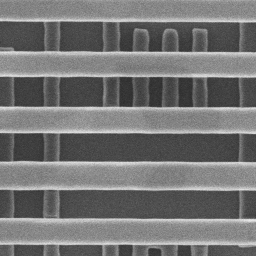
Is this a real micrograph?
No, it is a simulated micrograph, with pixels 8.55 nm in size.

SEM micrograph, wiring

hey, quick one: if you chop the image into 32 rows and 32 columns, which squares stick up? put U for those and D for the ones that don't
UUUUUUUUUUUUUUUUUUUUUUUUUUUUUUUU
UUUUUUUUUUUUUUUUUUUUUUUUUUUUUUUU
UUUUUUUUUUUUUUUUUUUUUUUUUUUUUUUU
DDDDDDDDDDDDDDDDDDDDDDDDDDDDDDDD
DDDDDDDDDDDDDDDDDDDDDDDDDDDDDDDD
DDDDDDDDDDDDDDDDDDDDDDDDDDDDDDDD
UUUUUUUUUUUUDDUUUUUDDDDDDDDDDDDD
UUUUUUUUUUUUUUUUUUUUUUUUUUUUUUUU
UUUUUUUUUUUUUUUUUUUUUUUUUUUUUUUU
UUUUUUUUUUUUUUUUUUUUUUUUUUUUUUUU
DDDDDDDDDDDDDDDDDDDDDDDDDDDDDDDD
DDDDDDDDDDDDDDDDDDDDDDDDDDDDDDDD
DDDDDDDDDDDDDDDDDDDDDDDDDDDDDDDD
UUUUUUUUUUUUUUUUUUUDDUDDDDDDDDDD
UUUUUUUUUUUUUUUUUUUUUUUUUUUUUUUU
UUUUUUUUUUUUUUUUUUUUUUUUUUUUUUUU
UUUUUUUUUUUUUUUUUUUUUUUUUUUUUUUU
DDDDDDDDDDDDDDDDDDDDDDDDDDDDDDDD
DDDDDDDDDDDDDDDDDDDDDDDDDDDDDDDD
DDDDDDDDDDDDDDDDDDDDDDDDDDDDDDDD
UUUUUUUUUUUUUUUUUUUUUUUUUUUUUUUU
UUUUUUUUUUUUUUUUUUUUUUUUUUUUUUUU
UUUUUUUUUUUUUUUUUUUUUUUUUUUUUUUU
UUUUUUUUUUUUUUUUUUUUUUUUUUUUUUUU
DDDDDDDDDDDDDDDDDDDDDDDDDDDDDDDD
DDDDDDDDDDDDDDDDDDDDDDDDDDDDDDDD
DDDDDDDDDDDDDDDDDDDDDDDDDDDDDDDD
UUUUUUUUUUUUUUUUUUUUUUUUUUUUUUUU
UUUUUUUUUUUUUUUUUUUUUUUUUUUUUUUU
UUUUUUUUUUUUUUUUUUUUUUUUUUUUUUUU
DDDDDDDUUDDDDDDDDUUDDDUUUUUUUUUU
DDDDDDDDDDDDDDDDDDDDDDDDDDDDDDDD